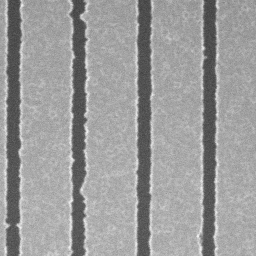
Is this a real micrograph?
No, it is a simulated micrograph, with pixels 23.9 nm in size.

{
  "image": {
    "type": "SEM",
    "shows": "one or a few lines or trenches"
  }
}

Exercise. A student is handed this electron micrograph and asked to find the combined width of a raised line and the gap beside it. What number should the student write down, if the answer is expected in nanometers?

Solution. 1560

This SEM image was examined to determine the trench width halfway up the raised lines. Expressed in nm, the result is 1200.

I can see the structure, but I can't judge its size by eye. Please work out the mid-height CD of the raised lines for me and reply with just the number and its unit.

362 nm